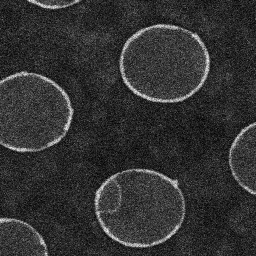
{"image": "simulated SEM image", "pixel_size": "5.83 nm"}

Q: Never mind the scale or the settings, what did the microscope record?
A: raised bodies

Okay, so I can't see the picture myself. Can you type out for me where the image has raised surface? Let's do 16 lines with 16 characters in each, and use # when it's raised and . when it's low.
................
................
........#####...
........#####...
........#####...
####....####....
####............
####............
####...........#
..............##
..............##
......#####....#
......#####.....
......#####.....
##.....####.....
###.............